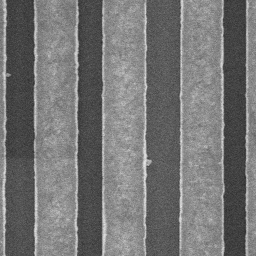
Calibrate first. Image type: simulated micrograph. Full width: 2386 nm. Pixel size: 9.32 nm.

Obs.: lines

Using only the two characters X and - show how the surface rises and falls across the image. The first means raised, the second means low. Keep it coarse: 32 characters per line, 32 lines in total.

X---XXXXXX---XXXXX-----XXXXX---X
X---XXXXXX---XXXXX-----XXXXX---X
X---XXXXXX---XXXXX-----XXXXX---X
X---XXXXXX---XXXXX-----XXXXX---X
X---XXXXXX---XXXXX-----XXXXX---X
X---XXXXXX---XXXXX-----XXXXX---X
X---XXXXXX---XXXXX-----XXXXX---X
X---XXXXXX---XXXXX-----XXXXX---X
X---XXXXXX---XXXXX-----XXXXX---X
X---XXXXXX---XXXXX-----XXXXX---X
X---XXXXXX---XXXXX-----XXXXX---X
X---XXXXXX---XXXXX-----XXXXX---X
X---XXXXXX---XXXXX-----XXXXX---X
X---XXXXXX---XXXXX-----XXXXX---X
X---XXXXXX---XXXXX-----XXXXX---X
X---XXXXXX---XXXXX-----XXXXX---X
X---XXXXXX---XXXXX-----XXXXX---X
X---XXXXXX---XXXXX-----XXXXX---X
X---XXXXXX---XXXXX-----XXXXX---X
X---XXXXXX---XXXXX-----XXXXX---X
X---XXXXXX---XXXXX-----XXXXX---X
X---XXXXXX---XXXXX-----XXXXX---X
X---XXXXXX---XXXXX-----XXXXX---X
X---XXXXXX---XXXXX-----XXXXX---X
X---XXXXXX---XXXXX-----XXXXX---X
X---XXXXXX---XXXXX-----XXXXX---X
X---XXXXXX---XXXXX-----XXXXX---X
X---XXXXXX---XXXXX-----XXXXX---X
X---XXXXXX---XXXXX-----XXXXX---X
X---XXXXXX---XXXXX-----XXXXX---X
X---XXXXXX---XXXXX-----XXXXX---X
X---XXXXXX---XXXXX-----XXXXX---X